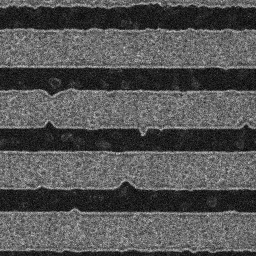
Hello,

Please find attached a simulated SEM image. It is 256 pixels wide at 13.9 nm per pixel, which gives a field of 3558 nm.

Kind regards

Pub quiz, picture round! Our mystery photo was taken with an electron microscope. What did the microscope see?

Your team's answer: one or a few lines or trenches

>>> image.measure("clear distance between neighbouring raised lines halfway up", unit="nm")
342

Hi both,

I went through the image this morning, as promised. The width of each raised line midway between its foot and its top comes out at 36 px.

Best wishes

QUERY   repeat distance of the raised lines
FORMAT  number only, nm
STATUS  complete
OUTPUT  848